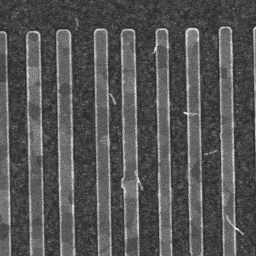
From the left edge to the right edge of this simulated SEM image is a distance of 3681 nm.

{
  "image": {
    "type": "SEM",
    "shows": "parallel lines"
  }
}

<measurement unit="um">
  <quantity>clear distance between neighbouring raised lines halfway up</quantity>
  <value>0.289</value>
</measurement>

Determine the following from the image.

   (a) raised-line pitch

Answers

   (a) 460 nm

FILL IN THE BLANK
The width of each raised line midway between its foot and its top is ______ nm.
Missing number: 182